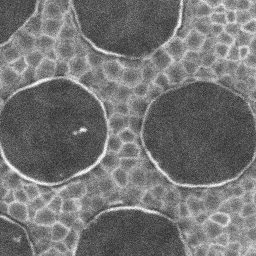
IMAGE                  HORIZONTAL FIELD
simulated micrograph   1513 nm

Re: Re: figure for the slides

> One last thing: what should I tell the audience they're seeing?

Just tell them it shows raised bodies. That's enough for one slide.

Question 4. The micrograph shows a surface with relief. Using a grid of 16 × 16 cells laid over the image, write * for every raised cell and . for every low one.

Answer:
**...******.....
**...******.....
*....******.....
........*.......
................
.****......***..
******...*******
*******..*******
*******..*******
*******..*******
.*****....*****.
...........***..
................
......****......
**...******.....
**...*******....